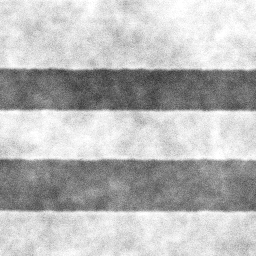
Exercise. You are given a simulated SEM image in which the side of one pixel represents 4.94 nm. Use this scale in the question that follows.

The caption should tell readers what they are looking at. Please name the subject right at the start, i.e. lines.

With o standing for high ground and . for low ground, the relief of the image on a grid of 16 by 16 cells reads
oooooooooooooooo
oooooooooooooooo
oooooooooooooooo
oooooooooooooooo
................
................
................
oooooooooooooooo
oooooooooooooooo
oooooooooooooooo
................
................
................
oooooooooooooooo
oooooooooooooooo
oooooooooooooooo